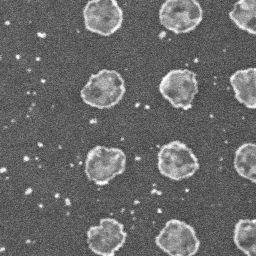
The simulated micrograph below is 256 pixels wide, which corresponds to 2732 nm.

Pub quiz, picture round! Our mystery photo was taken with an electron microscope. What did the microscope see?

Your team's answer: raised bodies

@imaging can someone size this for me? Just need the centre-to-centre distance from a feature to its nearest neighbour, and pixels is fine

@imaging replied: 73.1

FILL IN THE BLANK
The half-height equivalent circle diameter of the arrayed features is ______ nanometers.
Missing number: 386